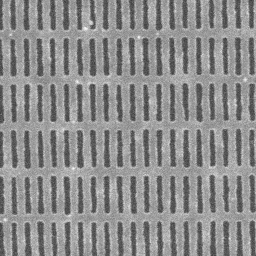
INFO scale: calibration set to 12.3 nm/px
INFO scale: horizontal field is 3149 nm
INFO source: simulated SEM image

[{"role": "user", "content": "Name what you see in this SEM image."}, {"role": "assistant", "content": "a regular array of holes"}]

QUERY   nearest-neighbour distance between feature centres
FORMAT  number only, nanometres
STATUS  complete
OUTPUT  162